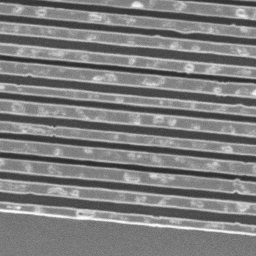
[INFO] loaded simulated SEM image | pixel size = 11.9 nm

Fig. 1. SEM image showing parallel lines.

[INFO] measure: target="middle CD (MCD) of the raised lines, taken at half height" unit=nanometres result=137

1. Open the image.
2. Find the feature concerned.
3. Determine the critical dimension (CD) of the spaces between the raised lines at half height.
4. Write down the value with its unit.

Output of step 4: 92.1 nanometres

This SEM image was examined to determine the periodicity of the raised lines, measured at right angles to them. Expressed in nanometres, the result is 235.